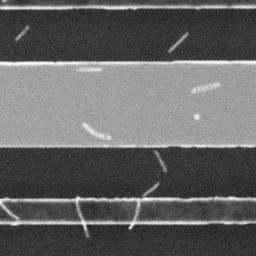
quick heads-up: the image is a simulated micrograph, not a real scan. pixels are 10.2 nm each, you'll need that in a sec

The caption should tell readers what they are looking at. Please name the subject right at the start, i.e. lines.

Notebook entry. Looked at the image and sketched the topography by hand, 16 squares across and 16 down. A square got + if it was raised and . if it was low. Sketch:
................
................
................
................
++++++++++++++++
++++++++++++++++
++++++++++++++++
++++++++++++++++
++++++++++++++++
................
................
................
++.+++++++++++++
++++++++++++++++
................
................